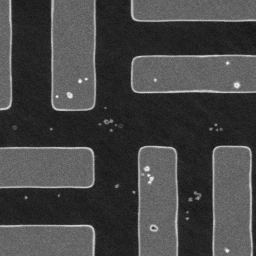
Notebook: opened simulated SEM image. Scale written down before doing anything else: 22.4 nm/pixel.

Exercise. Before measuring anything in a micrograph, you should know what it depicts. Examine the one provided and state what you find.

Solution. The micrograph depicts groups of lines, slits or small figures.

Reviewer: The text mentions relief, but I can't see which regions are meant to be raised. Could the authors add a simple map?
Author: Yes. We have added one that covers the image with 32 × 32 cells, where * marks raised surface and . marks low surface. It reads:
*......*****....****************
*......*****....****************
*......*****.....******.*******.
*......*****....................
*......*****....................
*......*****....................
*......*****....................
*......*****.....***************
*......*****....****************
*......*****....****************
*......*****....****************
*......*****.....****......*****
*......*****....................
*......****.....................
................................
................................
................................
................................
..................***......****.
************.....*****.....****.
************.....*****.....****.
************.....*****.....****.
************.....*****.....****.
.................*****.....****.
.................*****.....****.
.................*****.....****.
.................*****.....****.
.................*****.....****.
************.....*****.....****.
************.....*****.....****.
************.....*****.....****.
************.....*****.....****.